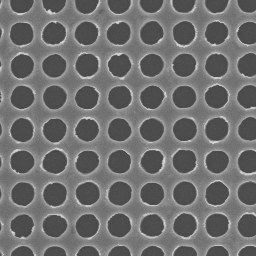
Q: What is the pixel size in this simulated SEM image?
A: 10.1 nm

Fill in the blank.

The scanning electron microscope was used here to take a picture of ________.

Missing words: a regular array of holes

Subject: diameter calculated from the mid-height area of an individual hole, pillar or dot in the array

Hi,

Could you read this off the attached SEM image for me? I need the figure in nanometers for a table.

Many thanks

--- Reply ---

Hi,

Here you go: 235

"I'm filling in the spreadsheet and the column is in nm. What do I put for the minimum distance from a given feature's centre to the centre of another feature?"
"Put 319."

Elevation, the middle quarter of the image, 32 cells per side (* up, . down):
.**......**......**......**.....
***.....***.....***......**.....
****....****....****....****....
********************************
********************************
*****.*******..*******.******..*
****....****....****....****....
.**.....***......**......**.....
.**......**......**......**.....
***.....***......**.....****....
****....****....****....****....
********************************
********************************
*****************************..*
****....****....****....****....
.**......**.....***......**.....
.**......**......**......**.....
***......**......**......***....
****....****....****....****....
*****.**************************
********************************
**********************.******.**
****....****....****....****....
****.....**......**......**.....
.**......**......**.....***.....
***.....***......**.....***.....
****...*****....****....****....
*****.**************************
********************************
*****..******..**************..*
****.....***....****....****....
***......**......**......**.....